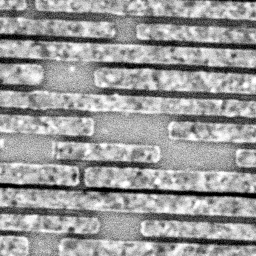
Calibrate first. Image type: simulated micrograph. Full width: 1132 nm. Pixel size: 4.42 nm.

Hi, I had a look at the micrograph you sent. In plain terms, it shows parallel lines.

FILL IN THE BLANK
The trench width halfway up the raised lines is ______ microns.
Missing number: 0.0348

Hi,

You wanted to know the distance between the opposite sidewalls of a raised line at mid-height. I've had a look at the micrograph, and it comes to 73.4 nm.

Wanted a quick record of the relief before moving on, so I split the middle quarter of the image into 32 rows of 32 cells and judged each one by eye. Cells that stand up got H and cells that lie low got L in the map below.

LLLLLLLLLLLLLLLLLLLLLLLLLLLLLLLL
LLLLLLLLHHHHHHHHHHHHHLLLLLLLLLLL
LLLLLLLLHHHHHHHHHHHHHHHHHHHHHHHH
LLLLLLLLHHHHHHHHHHHHHHHHHHHHHHHH
LLLLLLLLHHHHHHHHHHHHHHHHHHHHHHHH
LLLLLLLLLHHHHHHHHHHHHHHHHHHHHHHH
LLLLLLLLLLLLLLLLLLLLLLLLLLLLLHHH
LLLLLLLLLLLLLLLLLLLLLLLLLLLLLLLL
HHHHHHHHHHHHHHHHHHHHHLLLLLLLLLLL
HHHHHHHHHHHHHHHHHHHHHHHHHHHHHHHH
HHHHHHHHHHHHHHHHHHHHHHHHHHHHHHHH
LLLLLLLLHHLLLHHHHHHHHHHHHHHHHHHH
LLLLLLLLLLLLLLLLLLLLLLLLLLLLLLLL
LLLLLLLLLLLLLLLLLLLLLLLLLLLLLLLL
HHHHHHHLLLLLLLLLLLLLLLLLLLLLLLLL
HHHHHHHLLLLLLLLLLLLLLLLLLLHHHHHH
HHHHHHHLLLLLLLLLLLLLLLLLLLLHHHHH
HHHHHHHLLLLLLLLLLLLLLLLLLLHHHHHH
LLLLLLLLLLLLLLLLLLLLLLLLLLLHHHHH
LLLLLLLLLLLLLLLLLLLLLLLLLLLLLLLL
HHHHHHHHHHHHHHHHHHHLLLLLLLLLLLLL
HHHHHHHHHHHHHHHHHHHHHHHHLLLLLLLL
HHHHHHHHHHHHHHHHHHHHHHHHLLLLLLLL
HHHHHHHHHHHHHHHHHHHHHHHHLLLLLLLL
LLLLLLLLLLLLLLLLLLLLLHHLLLLLLLLL
LLLLLLLLLLLLLLLLLLLLLLLLLLLLLLLL
HHHLLLHHHHHHHHHHHHHHHLLLLLLLLLLL
HHHLLLHHHHHHHHHHHHHHHHHHHHHHHHHH
HHHLLHHHHHHHHHHHHHHHHHHHHHHHHHHH
HHHLLHHHHHHHHHHHHHHHHHHHHHHHHHHH
LLLLLLLHHHHHHHHHHHHHHHHHHHHHHHHH
LLLLLLLLLLLLLLLLLLLLLLLLLLLLLLLH